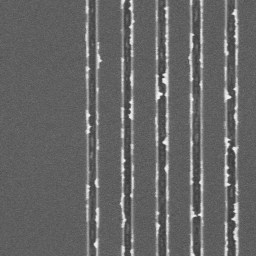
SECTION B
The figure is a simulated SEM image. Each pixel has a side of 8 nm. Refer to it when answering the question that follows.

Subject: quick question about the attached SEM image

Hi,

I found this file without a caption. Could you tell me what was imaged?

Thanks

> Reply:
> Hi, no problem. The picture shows parallel lines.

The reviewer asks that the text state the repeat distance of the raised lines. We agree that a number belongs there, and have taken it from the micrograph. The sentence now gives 277 nanometres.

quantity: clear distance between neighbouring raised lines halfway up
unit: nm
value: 65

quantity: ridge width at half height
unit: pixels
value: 26.2